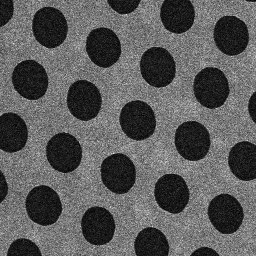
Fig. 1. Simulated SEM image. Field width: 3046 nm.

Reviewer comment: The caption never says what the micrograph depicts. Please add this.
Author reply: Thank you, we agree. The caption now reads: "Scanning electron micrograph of a regular array of holes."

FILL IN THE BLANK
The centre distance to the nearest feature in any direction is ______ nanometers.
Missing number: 670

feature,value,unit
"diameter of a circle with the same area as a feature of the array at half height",453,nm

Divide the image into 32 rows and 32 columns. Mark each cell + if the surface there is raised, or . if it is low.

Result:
..++++++++++++...+++....++++++++
..+++...+++++++..+++....++++++++
.+++....++++++++++++....+++...++
++++....++++.++++++++...+++....+
++++....+++....++++++++++++....+
+++++...+++....++++++++++++....+
+++++++++++....+++...+++++++..++
+++.+++++++....+++....++++++++++
++...+++++++++++++....++++.+++++
++....++++++++++++....+++...++++
++....+++...+++++++..+++.....+++
++....++....++++++++++++.....+++
++++++++.....++++++++++++...+++.
+++++++++....++....+++++++.++++.
..+++++++...+++....++++++++++++.
...++++++++++++....++++..+++++++
...++++++++++++....+++....++++++
...+++....+++++++.++++....++++++
...+++....++++++++++++....+++...
++++++....++++..+++++++...+++...
++++++....+++....++++++++++++...
++++++++.++++....++++++++++++...
.++++++++++++....+++...+++++++.+
.+++..+++++++...+++.....++++++++
.++....++++++++++++.....+++..+++
+++.....++++++++++++...+++....++
+++.....+++...+++++++.++++....++
++++...+++....++++++++++++....++
++++++++++....++++.++++++++...++
++++++++++....+++....+++++++++++
+...++++++++.++++....+++++++++++
+....++++++++++++....+++...+++++